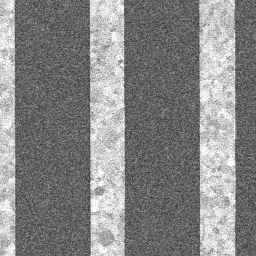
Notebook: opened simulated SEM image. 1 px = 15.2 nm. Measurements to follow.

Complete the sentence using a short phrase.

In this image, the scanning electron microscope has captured one or a few lines or trenches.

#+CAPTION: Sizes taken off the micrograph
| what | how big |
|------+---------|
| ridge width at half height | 512 nm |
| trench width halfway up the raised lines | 1.15 micrometres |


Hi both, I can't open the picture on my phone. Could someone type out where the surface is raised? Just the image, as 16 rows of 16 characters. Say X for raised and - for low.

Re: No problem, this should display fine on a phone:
X-----XX----XXX-
X-----XX----XXX-
X-----XX----XXX-
X-----XX-----XX-
X-----XX-----XX-
X-----XX----XXX-
X-----XX----XXX-
X-----XX-----XX-
X-----XX----XXX-
X-----XX-----XX-
X-----XX-----XX-
X-----XX-----XX-
X-----XX-----XX-
X-----XX-----XX-
X-----XX-----XX-
X-----XX-----XX-